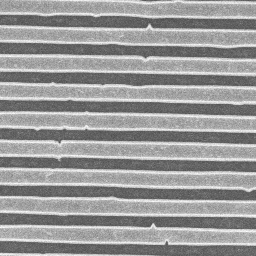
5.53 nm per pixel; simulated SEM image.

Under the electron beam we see parallel lines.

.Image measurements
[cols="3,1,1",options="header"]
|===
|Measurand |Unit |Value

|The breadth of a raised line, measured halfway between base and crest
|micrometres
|0.0878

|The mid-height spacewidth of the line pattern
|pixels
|13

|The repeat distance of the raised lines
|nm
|157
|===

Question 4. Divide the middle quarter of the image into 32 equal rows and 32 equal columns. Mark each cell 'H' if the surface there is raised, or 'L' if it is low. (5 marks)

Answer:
HHHHHHHHHHHHHHHHHHHHHHHHHHHHHHHH
HHHHHHHHHHHHHHHHHHHHHHHHHHHHHHHH
LLLLLLLLLLLLLLLLLLLLLLLLLLLLLLLL
LLLLLLLLLLLLLLLLLLLLLLLLLLLLLLLL
LLLLLLLLLLLLLLLLLLLLLLLLLLLLLLLL
HHHHHHLLLLHHHHHHLLLLLLLLLLLLLLLL
HHHHHHHHHHHHHHHHHHHHHHHHHHHHHHHH
HHHHHHHHHHHHHHHHHHHHHHHHHHHHHHHH
HHHHHHHHHHHHHHHHHHHHHHHHHHHHHHHH
LLLLLLLLLLLLLLLLLLLLLLLLLLLLLLLL
LLLLLLLLLLLLLLLLLLLLLLLLLLLLLLLL
LLLLLLLLLLLLLLLLLLLLLLLLLLLLLLLL
HHHHHHHLLLLLLLLLLLLLLLLLLLLLLLLL
HHHHHHHHHHHHHHHHHHHHHHHHHHHHHHHH
HHHHHHHHHHHHHHHHHHHHHHHHHHHHHHHH
HHHHHHHHHHHHHHHHHHHHHHHHHHHHHHHH
LLLLLLLLLLLLLLLLLLLLLLLLLLLLLLLL
LLLLLLLLLLLLLLLLLLLLLLLLLLLLLLLL
LLLLLLLLLLLLLLLLLLLLLLLLLLLLLLLL
HHHHHLLLLLLLLLLLLLLLLLLLLLLLLLLL
HHHHHHHHHHHHHHHHHHHHHHHHHHHHHHHH
HHHHHHHHHHHHHHHHHHHHHHHHHHHHHHHH
HHHHHHHHHHHHHHHHHHHHHHHHHHHHHHHH
LLLLLLLLLLLLLLLLLLLHHHHHHHHHHHHH
LLLLLLLLLLLLLLLLLLLLLLLLLLLLLLLL
LLLLLLLLLLLLLLLLLLLLLLLLLLLLLLLL
HHHHLLLLLLLLLLLLLLLLLLLLLLLLLLLL
HHHHHHHHHHHHHHHHHHHHHHHHHHHHHHHH
HHHHHHHHHHHHHHHHHHHHHHHHHHHHHHHH
HHHHHHHHHHHHHHHHHHHHHHHHHHHHHHHH
LLLLLLLLLLLLLLLLLLLHHHHHHHHHHHHH
LLLLLLLLLLLLLLLLLLLLLLLLLLLLLLLL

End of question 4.